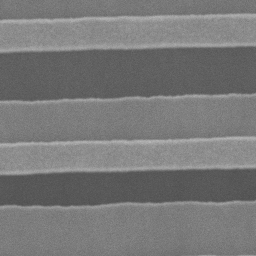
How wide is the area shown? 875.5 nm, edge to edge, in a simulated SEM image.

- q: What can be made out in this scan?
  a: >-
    lines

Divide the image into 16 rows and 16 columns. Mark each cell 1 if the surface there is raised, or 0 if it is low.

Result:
1111111111111111
1111111111111111
1111111111111111
0000000000000000
0000000000000000
0000000000000000
1111111111111111
1111111111111111
1111111111111111
1111111111111111
1111111111111111
0000000000000000
0000000000000000
1111111111111111
1111111111111111
1111111111111111